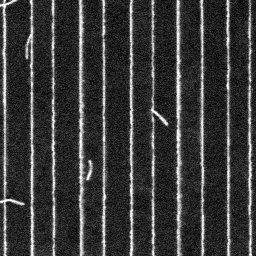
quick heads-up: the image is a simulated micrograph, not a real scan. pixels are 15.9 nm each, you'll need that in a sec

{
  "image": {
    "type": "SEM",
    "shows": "lines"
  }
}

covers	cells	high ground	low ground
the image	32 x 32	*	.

*...***...***...***...***...***.
....***...***...***...***...***.
*...***...***...***...***...***.
*...***...***...***...***...***.
*...***...***...***...***...***.
*...***...***...***...***...***.
*...***...***...***...***....**.
*...***...***...***...***....**.
*...***...***...***...***....**.
*...***...***...***...***....**.
*...***...***...***...***...***.
*...***...***...***...***....**.
*...***...***...***...***....**.
*...***...***...***...***....**.
*...***...***...***...***....**.
*...***...***...***...***....**.
*...***...***...***...***....**.
*...***...***...***...***....**.
*...***...***...***...***....**.
*...***...***...***...***....**.
*...***...***...***...***....**.
*...***...***...***...***....**.
*...***...***...***...***....**.
*...***...***...***...***....**.
*...***...***...***...***....**.
*...***...***...***...***....**.
*...***...***...***...***....**.
*...***...***...***...***....**.
*...***...***...***...***....**.
*...***...***...***...***....**.
*...***...***...***...***....**.
*...***...***...***...***....**.